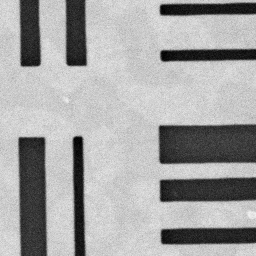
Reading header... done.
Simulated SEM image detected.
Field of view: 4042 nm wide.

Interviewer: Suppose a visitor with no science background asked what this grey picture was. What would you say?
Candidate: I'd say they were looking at groups of lines, slits or small figures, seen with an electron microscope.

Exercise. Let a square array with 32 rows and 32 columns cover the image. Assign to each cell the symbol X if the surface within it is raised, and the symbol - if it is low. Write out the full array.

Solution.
XX---XXX---XXXXXXXXXX-----------
XX---XXX---XXXXXXXXX------------
XX---XXX---XXXXXXXXXXXXXXXXXXXXX
XX---XXX---XXXXXXXXXXXXXXXXXXXXX
XX---XXX---XXXXXXXXXXXXXXXXXXXXX
XX---XXX---XXXXXXXXXXXXXXXXXXXXX
XX---XXX---XXXXXXXXX------------
XX---XXX---XXXXXXXXX------------
XXXXXXXXXXXXXXXXXXXXXXXXXXXXXXXX
XXXXXXXXXXXXXXXXXXXXXXXXXXXXXXXX
XXXXXXXXXXXXXXXXXXXXXXXXXXXXXXXX
XXXXXXXXXXXXXXXXXXXXXXXXXXXXXXXX
XXXXXXXXXXXXXXXXXXXXXXXXXXXXXXXX
XXXXXXXXXXXXXXXXXXXXXXXXXXXXXXXX
XXXXXXXXXXXXXXXXXXXXXXXXXXXXXXXX
XXXXXXXXXXXXXXXXXXXXXXXXXXXX----
XXXXXXXXXXXXXXXXXXXX------------
XX----XXX-XXXXXXXXXX------------
XX----XXX--XXXXXXXXX------------
XX----XXX--XXXXXXXXX------------
XX----XXX--XXXXXXXXX-----XXXXXXX
XX----XXX--XXXXXXXXXXXXXXXXXXXXX
XX----XXX--XXXXXXXXX------------
XX----XXX--XXXXXXXXX------------
XX----XXX--XXXXXXXXX------------
XX----XXX--XXXXXXXXXXXXXXXXXXXXX
XX----XXX--XXXXXXXXXXXXXXXXXXXXX
XX----XXX--XXXXXXXXXXXXXXXXXXXXX
XX----XXX--XXXXXXXXXXX----------
XX----XXX--XXXXXXXXX------------
XX----XXX--XXXXXXXXX-----------X
XX----XXX--XXXXXXXXXXXXXXXXXXXXX